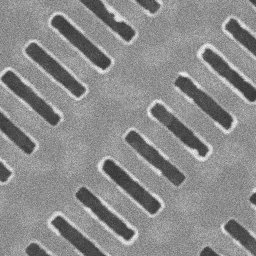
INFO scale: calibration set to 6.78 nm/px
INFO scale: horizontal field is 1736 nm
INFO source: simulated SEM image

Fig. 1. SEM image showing a regular array of holes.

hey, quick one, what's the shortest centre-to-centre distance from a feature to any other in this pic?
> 0.254 micrometres